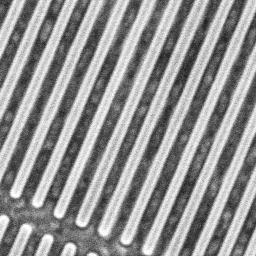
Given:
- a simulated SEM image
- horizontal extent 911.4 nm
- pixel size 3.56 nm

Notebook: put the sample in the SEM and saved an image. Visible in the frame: parallel lines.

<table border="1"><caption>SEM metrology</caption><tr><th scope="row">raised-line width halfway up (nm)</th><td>31.5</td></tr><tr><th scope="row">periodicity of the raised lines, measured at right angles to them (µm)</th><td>0.0854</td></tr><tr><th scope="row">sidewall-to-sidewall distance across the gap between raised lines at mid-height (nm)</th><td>52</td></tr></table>